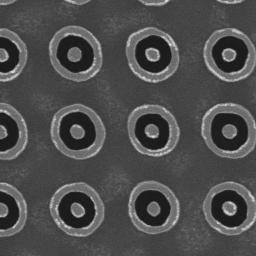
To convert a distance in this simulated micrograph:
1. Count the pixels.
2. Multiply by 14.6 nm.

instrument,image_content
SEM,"ring-shaped raised bodies with a dot in the middle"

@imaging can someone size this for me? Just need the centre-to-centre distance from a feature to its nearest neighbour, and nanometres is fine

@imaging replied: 1110